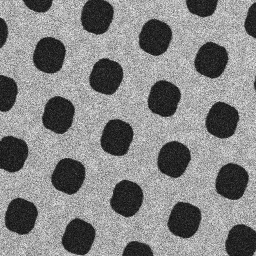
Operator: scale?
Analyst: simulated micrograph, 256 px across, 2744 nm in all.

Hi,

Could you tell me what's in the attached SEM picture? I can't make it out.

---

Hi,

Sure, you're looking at a regular array of holes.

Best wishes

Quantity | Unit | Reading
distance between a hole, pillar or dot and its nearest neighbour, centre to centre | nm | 654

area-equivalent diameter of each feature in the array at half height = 371 nm